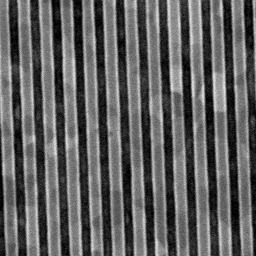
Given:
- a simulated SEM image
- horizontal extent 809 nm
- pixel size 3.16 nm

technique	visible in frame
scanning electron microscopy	parallel lines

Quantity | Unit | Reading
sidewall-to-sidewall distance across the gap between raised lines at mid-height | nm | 32.8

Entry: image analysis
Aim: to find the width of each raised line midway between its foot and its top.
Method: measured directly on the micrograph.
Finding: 11.3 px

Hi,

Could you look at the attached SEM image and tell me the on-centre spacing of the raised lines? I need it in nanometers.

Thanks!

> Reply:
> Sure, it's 67.6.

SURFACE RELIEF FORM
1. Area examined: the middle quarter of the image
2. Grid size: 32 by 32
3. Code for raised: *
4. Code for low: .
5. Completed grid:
***..***...**...***..***...**...
***..***...**...***..***...**...
***..***...**...***...**...**...
***..***...**...***...**...**...
***...**...**...***...**...**...
***...**...**...***...**...**...
***...**...**...***...**...**...
***...**...**...***...**...**...
***...**...**...***...**...***..
***...**...***..***...**...***..
***...**...***..***...**...**...
***...**...***..***...**...***..
***...**...***..***...**...***..
***...**...***...**...**...***..
***...**...***...**...**...***..
.**...**...***...**...**...***..
.**...**...***...**...**...***..
.**...**...***...**...***..***..
.**...**...***...**...***..***..
.**...**...***...**...***...**..
.**...***..***...**...***..***..
.**...***..***...**...***..***..
.**...***..***...**...***..***..
.**...***..***...**...***...**..
.**...***...**...***..***...**..
.***..***...**...***..***...**..
.***..***...**...***..***...**..
.***..***...**...***..***...**..
.***..***...**...***...**...**..
.**...***...**...***..***...**..
.***...**...**...***..***...**..
.***...**...**...***...**...**..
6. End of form